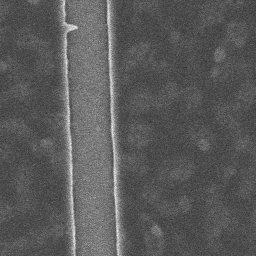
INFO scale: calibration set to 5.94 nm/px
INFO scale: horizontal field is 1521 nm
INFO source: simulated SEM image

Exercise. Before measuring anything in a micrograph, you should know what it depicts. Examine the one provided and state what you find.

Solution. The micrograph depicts one or a few lines or trenches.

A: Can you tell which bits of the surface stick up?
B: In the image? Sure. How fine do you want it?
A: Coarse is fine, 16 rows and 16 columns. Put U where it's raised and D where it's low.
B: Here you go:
UUUUDDDUUUUUUUUU
UUUUDDDUUUUUUUUU
UUUUDDDUUUUUUUUU
UUUUDDDUUUUUUUUU
UUUUDDDUUUUUUUUU
UUUUDDDUUUUUUUUU
UUUUDDDUUUUUUUUU
UUUUDDDUUUUUUUUU
UUUUDDDUUUUUUUUU
UUUUDDDUUUUUUUUU
UUUUDDDUUUUUUUUU
UUUUUDDUUUUUUUUU
UUUUUDDUUUUUUUUU
UUUUUDDUUUUUUUUU
UUUUUDDUUUUUUUUU
UUUUUDDUUUUUUUUU